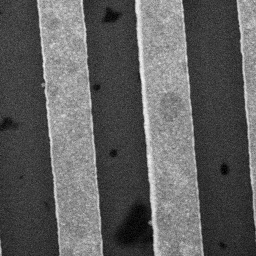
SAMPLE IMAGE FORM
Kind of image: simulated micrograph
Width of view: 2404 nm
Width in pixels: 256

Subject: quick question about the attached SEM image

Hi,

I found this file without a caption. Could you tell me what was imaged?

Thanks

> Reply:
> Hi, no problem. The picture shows lines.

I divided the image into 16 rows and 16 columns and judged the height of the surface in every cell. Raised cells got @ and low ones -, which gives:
--@@@---@@@----@
--@@@----@@@---@
---@@----@@@---@
---@@----@@@---@
---@@@---@@@---@
---@@@---@@@---@
---@@@---@@@---@
---@@@---@@@---@
---@@@---@@@----
---@@@---@@@----
---@@@---@@@----
---@@@---@@@----
---@@@---@@@----
----@@----@@----
----@@----@@@---
----@@----@@@---